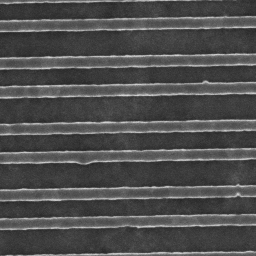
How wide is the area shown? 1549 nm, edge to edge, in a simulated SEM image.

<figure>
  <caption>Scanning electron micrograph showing parallel lines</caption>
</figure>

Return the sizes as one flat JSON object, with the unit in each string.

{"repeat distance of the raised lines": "199 nm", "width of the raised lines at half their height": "63.5 nm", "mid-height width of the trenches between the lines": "25.5 px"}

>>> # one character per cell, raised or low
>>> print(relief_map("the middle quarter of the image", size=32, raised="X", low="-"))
XXXXXXXXXXXXXXXXXXXXXXX---------
--------------------------------
--------------------------------
--------------------------------
--------------------------------
-XXXXXXXXXXXXXXXXXXXXXXXXXXXXXXX
XXXXXXXXXXXXXXXXXXXXXXXXXXXXXXXX
XXXXXXXXXXXXXXXXXXXXXXXXXXXXX---
--------------------------------
--------------------------------
--------------------------------
--------------------------------
--------------------------------
--------------------------------
-----------------------XXXXXXXXX
XXXXXXXXXXXXXXXXXXXXXXXXXXXXXXXX
XXXXXXXXXXXXXXXXXXXXXXXXXXXXXXXX
--------------------------------
--------------------------------
--------------------------------
--------------------------------
-----------------------------XXX
XXXXXXXXXXXXXXXXXXXXXXXXXXXXXXXX
XXXXXXXXXXXXXXXXXXXXXXXXXXXXXXXX
-XXXXXX-------------------------
--------------------------------
--------------------------------
--------------------------------
--------------------------------
--------------------------------
--------------------------------
XXXXXXXXXXXXXXXXXXXXXXXXXXXXXXXX